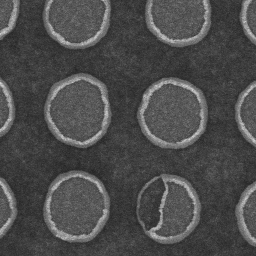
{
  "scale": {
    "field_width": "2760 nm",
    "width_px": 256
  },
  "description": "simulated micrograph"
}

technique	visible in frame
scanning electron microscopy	raised bodies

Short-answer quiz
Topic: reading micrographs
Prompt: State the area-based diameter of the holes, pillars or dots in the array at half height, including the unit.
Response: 707 nm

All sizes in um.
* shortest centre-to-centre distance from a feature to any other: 1.03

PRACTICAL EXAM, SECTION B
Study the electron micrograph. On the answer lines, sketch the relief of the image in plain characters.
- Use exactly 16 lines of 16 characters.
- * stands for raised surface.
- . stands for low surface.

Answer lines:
*..****..****..*
*..****..****..*
....**....**....
................
................
...***....**....
*..****..****..*
*..****..****..*
....**...***...*
................
................
...***....**....
*..****...**...*
*..****...**...*
...***....**...*
................